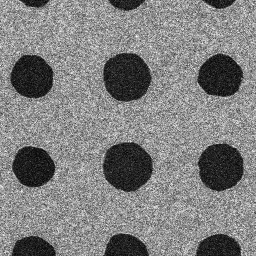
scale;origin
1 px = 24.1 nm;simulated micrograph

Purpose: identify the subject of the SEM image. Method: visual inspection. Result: holes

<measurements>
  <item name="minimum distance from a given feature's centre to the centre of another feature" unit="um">2.17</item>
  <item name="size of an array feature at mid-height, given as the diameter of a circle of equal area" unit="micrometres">1.09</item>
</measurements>